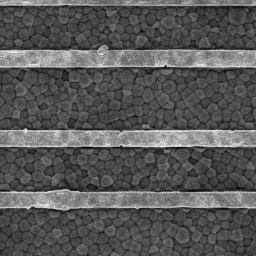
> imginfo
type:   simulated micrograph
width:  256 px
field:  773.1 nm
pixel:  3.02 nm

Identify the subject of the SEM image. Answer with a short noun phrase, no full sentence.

one or a few lines or trenches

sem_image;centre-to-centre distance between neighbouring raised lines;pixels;70.7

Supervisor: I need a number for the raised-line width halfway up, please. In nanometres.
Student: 47.6